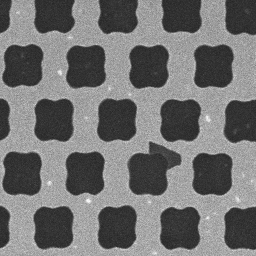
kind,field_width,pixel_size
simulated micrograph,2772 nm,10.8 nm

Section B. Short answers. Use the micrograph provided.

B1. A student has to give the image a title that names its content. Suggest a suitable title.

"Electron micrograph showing a regular array of holes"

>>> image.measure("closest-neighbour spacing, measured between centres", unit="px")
61.9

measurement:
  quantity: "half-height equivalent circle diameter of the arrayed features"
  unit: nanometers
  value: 475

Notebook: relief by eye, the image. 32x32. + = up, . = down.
.+++.....+++.....+++.....+++....
.++++....++++....+++.....+++....
.+++.....+++.....+++.....+++....
.+++.....++++....+++.....+++....
++++++++++++++++++++++++++++++++
++++++++++++++++++++++++++++++++
+....++++....+++.....+++.....+++
+....+++.....+++.....+++.....+++
+....+++.....+++.....+++.....+++
.....+++.....+++.....+++.....+++
+....++++....+++.....++++....+++
++++++++++++++++++++++++++++++++
.++++.+..++++...+++++.+.++++++++
.+++.....+++.....+++.....+++....
.+++.....+++.....+++.....+++....
.+++.....+++.....+++.....+++....
.+++.....+++.....+++.....+++....
+++++.+.+++++.+++++++...+++++...
+++++++++++++++++++..+++++++++++
+....++++....++++......++....+++
+....+++.....+++......++.....+++
+....+++.....+++.....+++.....+++
.....+++.....+++.....+++.....+++
.....+++.....+++.....+++.....+++
++++++++++++++++++++++++++++++++
++++++++++++++++++++++++++++++++
.+++.....++++....+++.....+++....
.+++.....+++.....+++.....+++....
.+++.....+++.....+++.....+++....
.+++.....+++.....+++.....+++....
.+++.....+++.....+++.....+++....
++++++++++++++++++++++++++++++++